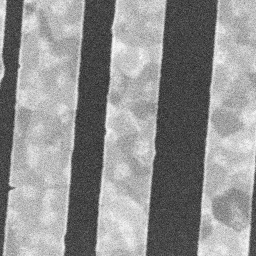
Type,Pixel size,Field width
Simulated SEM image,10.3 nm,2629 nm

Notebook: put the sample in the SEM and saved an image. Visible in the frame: one or a few lines or trenches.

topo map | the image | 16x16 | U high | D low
DDUUUDDUUUDDDDUU
DUUUUDDUUUDDDDUU
DUUUUDDUUUDDDUUU
DUUUUDDUUUDDDUUU
DUUUUDDUUUDDDUUU
DUUUUDDUUUDDDUUU
DUUUUDDUUUDDDUUU
DUUUUDDUUUDDDUUU
DUUUUDDUUUDDDUUU
DUUUDDDUUUDDDUUU
DUUUDDUUUUDDDUUU
DUUUDDUUUDDDDUUU
DUUUDDUUUDDDDUUU
DUUUDDUUUDDDDUUU
UUUUDDUUUDDDDUUU
UUUUDDUUUDDDUUUD